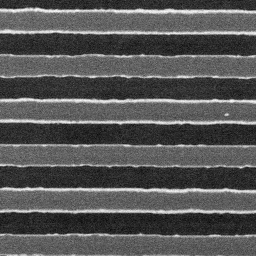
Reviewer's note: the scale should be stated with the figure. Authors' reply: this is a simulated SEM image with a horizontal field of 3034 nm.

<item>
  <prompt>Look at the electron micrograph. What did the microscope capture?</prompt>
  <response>lines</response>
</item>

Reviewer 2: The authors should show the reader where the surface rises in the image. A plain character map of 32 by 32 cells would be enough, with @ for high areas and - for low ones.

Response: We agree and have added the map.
--------------------------------
@@@@@@@@@@@@@@@@@@@@@@@@@@@@@@@@
@@@@@@@@@@@@@@@@@@@@@@@@@@@@@@@@
@@@@@@@@@@@@@@@@@@@@@@@@@@@@@@@@
--------------------------------
--------------------------------
--------------------------------
@@@@@@@@@@@@@@@@@@@@@@@@@@@@@@@@
@@@@@@@@@@@@@@@@@@@@@@@@@@@@@@@@
@@@@@@-@@@@@@@@@@@@@@@@@@@@@@@@@
--------------------------------
--------------------------------
@@@@@--@@@@---------@-----------
@@@@@@@@@@@@@@@@@@@@@@@@@@@@@@@@
@@@@@@@@@@@@@@@@@@@@@@@@@@@@@@@@
--------------------------------
--------------------------------
--------------------------------
@@@@@@@@@@@@@@@@@@@@@@@@@@@@@@@@
@@@@@@@@@@@@@@@@@@@@@@@@@@@@@@@@
@@@@@@@@@@@@@@@@@@@@@@@@@@@@@@@@
--------------------------------
--------------------------------
--------------------------------
@@@@@@@@@@@@@@@@@@@@@@@@@@@@@@@@
@@@@@@@@@@@@@@@@@@@@@@@@@@@@@@@@
--@----@@@@@@@@-@@@@@@@@@@@@@@@@
--------------------------------
--------------------------------
@@@@@@@@@@@@@@@@@@@@-@@---@@-@@@
@@@@@@@@@@@@@@@@@@@@@@@@@@@@@@@@
@@@@@@@@@@@@@@@@@@@@@@@@@@@@@@@@